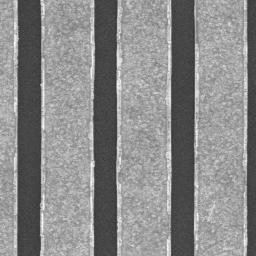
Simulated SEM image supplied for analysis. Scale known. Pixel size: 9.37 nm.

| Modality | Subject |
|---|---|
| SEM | one or a few lines or trenches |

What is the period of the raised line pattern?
720 nm